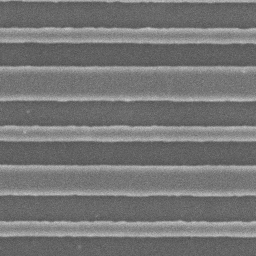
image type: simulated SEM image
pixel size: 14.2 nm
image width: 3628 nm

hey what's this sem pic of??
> lines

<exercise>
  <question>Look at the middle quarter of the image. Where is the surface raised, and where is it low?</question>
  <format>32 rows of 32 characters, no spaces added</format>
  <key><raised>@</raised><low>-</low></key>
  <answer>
--------------------------------
@@@@@@@@@@@@@@@@@@@@@@@@@@@@@@@@
@@@@@@@@@@@@@@@@@@@@@@@@@@@@@@@@
@@@@@@@@@@@@@@@@@@@@@@@@@@@@@@@@
@@@@@@@@@@@@@@@@@@@@@@@@@@@@@@@@
@@@@@@@@@@@@@@@@@@@@@@@@@@@@@@@@
@@@@@@@@@@@@@@@@@@@@@@@@@@@@@@@@
@@@@@@@@@@@@@@@@@@@@@@@@@@@@@@@@
@@@@@@@@@@@@@@@@@@@@@@@@@@@@@@@@
--------------------------------
--------------------------------
--------------------------------
--------------------------------
--------------------------------
--------------------------------
--------------------------------
@@@@@@@@@@@@@@@@@@@@@@@@@@@@@@@@
@@@@@@@@@@@@@@@@@@@@@@@@@@@@@@@@
@@@@@@@@@@@@@@@@@@@@@@@@@@@@@@@@
--------------------------------
--------------------------------
--------------------------------
--------------------------------
--------------------------------
--------------------------------
--------------------------------
@@@@@@@@@@@@@@@@@@@@@@@@@@@@@@@@
@@@@@@@@@@@@@@@@@@@@@@@@@@@@@@@@
@@@@@@@@@@@@@@@@@@@@@@@@@@@@@@@@
@@@@@@@@@@@@@@@@@@@@@@@@@@@@@@@@
@@@@@@@@@@@@@@@@@@@@@@@@@@@@@@@@
@@@@@@@@@@@@@@@@@@@@@@@@@@@@@@@@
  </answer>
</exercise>